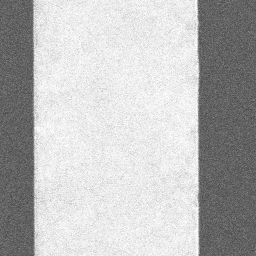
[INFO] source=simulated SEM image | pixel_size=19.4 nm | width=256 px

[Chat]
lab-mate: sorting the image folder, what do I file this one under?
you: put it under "one or a few lines or trenches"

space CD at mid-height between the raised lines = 3130 nanometers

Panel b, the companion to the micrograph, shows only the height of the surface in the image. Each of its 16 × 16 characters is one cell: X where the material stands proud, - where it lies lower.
XX----------XXXX
XX----------XXXX
XX----------XXXX
XX----------XXXX
XX----------XXXX
XX----------XXXX
XX----------XXXX
XX----------XXXX
XX----------XXXX
XX----------XXXX
XX----------XXXX
XX----------XXXX
XX----------XXXX
XX----------XXXX
XX----------XXXX
XX----------XXXX